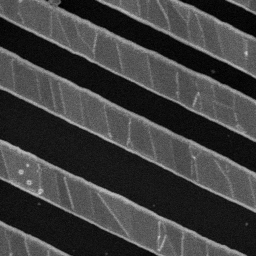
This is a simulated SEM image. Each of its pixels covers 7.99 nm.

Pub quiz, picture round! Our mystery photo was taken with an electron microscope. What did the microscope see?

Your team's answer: lines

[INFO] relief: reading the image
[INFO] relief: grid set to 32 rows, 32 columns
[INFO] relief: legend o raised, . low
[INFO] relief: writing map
ooooooo......oooooooooo......ooo
oooooooo.......oooooooooo......o
.oooooooooo......oooooooooo.....
...oooooooooo......oooooooooo...
.....oooooooooo......oooooooooo.
.......oooooooooo......ooooooooo
o........oooooooooo......ooooooo
ooo........oooooooooo......ooooo
ooooo........oooooooooo.......oo
ooooooo........ooooooooooo.....o
ooooooooo........ooooooooooo....
.ooooooooooo.......ooooooooooo..
...oooooooooo........ooooooooooo
.....oooooooooo........ooooooooo
.......oooooooooo........ooooooo
.........oooooooooo........ooooo
...........ooooooooooo.......ooo
.............ooooooooooo........
oo.............ooooooooooo......
oooo.............ooooooooooo....
oooooo..............oooooooooo..
oooooooo.............ooooooooooo
ooooooooooo............ooooooooo
..ooooooooooo............ooooooo
....ooooooooooo.............oooo
......ooooooooooo.............oo
.........oooooooooo.............
...........oooooooooo...........
oo...........oooooooooo.........
oooo...........oooooooooo.......
oooooo...........oooooooooo.....
oooooooo...........ooooooooooo..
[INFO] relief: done